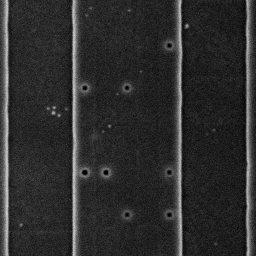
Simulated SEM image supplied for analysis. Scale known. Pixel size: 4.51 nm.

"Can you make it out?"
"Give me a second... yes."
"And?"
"wiring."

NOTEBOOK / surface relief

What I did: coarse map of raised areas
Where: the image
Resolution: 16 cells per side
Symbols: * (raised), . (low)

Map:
.....******....*
.....******....*
.....******....*
.....******....*
.....******....*
.....******....*
.....******....*
.....******....*
.....******....*
.....******....*
.....******....*
.....******....*
.....******....*
.....******....*
.....******....*
.....******....*